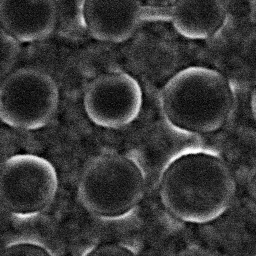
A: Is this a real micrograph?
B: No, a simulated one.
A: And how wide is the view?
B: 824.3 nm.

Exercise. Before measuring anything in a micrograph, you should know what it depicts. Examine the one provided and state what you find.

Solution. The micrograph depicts raised bodies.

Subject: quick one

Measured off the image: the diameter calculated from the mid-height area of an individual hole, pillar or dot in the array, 193 nanometers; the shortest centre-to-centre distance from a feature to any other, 180 nm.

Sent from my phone